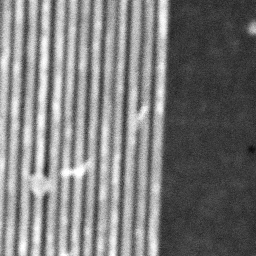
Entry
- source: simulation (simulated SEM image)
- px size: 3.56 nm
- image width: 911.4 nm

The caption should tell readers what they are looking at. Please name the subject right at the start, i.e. parallel lines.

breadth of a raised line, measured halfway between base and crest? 24.4 nanometres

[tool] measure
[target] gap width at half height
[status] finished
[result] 24 nm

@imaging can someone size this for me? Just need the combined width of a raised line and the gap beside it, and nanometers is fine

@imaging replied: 46.1